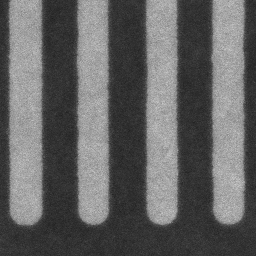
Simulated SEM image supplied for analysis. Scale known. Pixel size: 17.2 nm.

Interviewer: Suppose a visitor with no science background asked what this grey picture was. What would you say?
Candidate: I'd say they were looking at one or a few lines or trenches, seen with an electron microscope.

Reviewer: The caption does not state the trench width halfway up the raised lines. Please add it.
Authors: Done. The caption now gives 517 nanometres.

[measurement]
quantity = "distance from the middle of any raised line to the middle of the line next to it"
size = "1160 nm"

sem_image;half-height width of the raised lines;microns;0.644